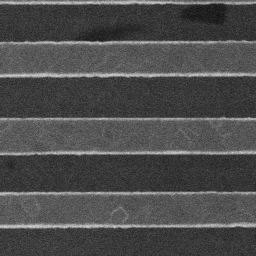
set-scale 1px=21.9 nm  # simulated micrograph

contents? lines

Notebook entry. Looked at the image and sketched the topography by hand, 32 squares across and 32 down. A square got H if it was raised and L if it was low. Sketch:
LLLLLLLLLLLLLLLLLLLLLLLLLLLLLLLL
LLLLLLLLLLLLLLLLLLLLLLLLLLLLLLLL
LLLLLLLLLLLLLLLLLLLLLLLLLLLLLLLL
LLLLLLLLLLLLLLLLLLLLLLLLLLLLLLLL
LLLLLLLLLLLLLLLLLLLLLLLLLLLLLLLL
HHHHHHHHHHHHHHHHHHHHHHHHHHHHHHHH
HHHHHHHHHHHHHHHHHHHHHHHHHHHHHHHH
HHHHHHHHHHHHHHHHHHHHHHHHHHHHHHHH
HHHHHHHHHHHHHHHHHHHHHHHHHHHHHHHH
HHHHHHHHLLLLHLLHLLLLLLLLLLLLLLLL
LLLLLLLLLLLLLLLLLLLLLLLLLLLLLLLL
LLLLLLLLLLLLLLLLLLLLLLLLLLLLLLLL
LLLLLLLLLLLLLLLLLLLLLLLLLLLLLLLL
LLLLLLLLLLLLLLLLLLLLLLLLLLLLLLLL
LLLLLLLLLLLLLLLLLLLLLLLLLLLLLLLL
HHHHHHHHHHHHHHHHHHHHHHHHHHHHHHHH
HHHHHHHHHHHHHHHHHHHHHHHHHHHHHHHH
HHHHHHHHHHHHHHHHHHHHHHHHHHHHHHHH
HHHHHHHHHHHHHHHHHHHHHHHHHHHHHHHH
LLLLLLLLLLLLLLLLLLLLLLLLLLLLLLLL
LLLLLLLLLLLLLLLLLLLLLLLLLLLLLLLL
LLLLLLLLLLLLLLLLLLLLLLLLLLLLLLLL
LLLLLLLLLLLLLLLLLLLLLLLLLLLLLLLL
LLLLLLLLLLLLLLLLLLLLLLLLLLLLLLLL
HHHHHHHHHHHHHHHHHHHHHHHHHHHHHHHH
HHHHHHHHHHHHHHHHHHHHHHHHHHHHHHHH
HHHHHHHHHHHHHHHHHHHHHHHHHHHHHHHH
HHHHHHHHHHHHHHHHHHHHHHHHHHHHHHHH
LLLLLLLLLLLLLLLLLLLLLLLLLLLLLLLL
LLLLLLLLLLLLLLLLLLLLLLLLLLLLLLLL
LLLLLLLLLLLLLLLLLLLLLLLLLLLLLLLL
LLLLLLLLLLLLLLLLLLLLLLLLLLLLLLLL